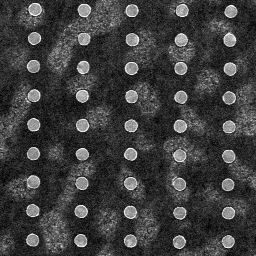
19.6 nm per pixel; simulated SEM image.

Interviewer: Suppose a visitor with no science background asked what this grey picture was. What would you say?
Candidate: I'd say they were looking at a regular array of raised bodies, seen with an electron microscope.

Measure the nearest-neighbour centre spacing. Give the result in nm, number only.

562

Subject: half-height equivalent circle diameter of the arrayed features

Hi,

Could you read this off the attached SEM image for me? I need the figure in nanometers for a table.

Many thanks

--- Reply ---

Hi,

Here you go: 244